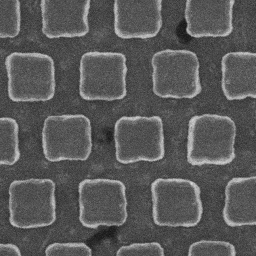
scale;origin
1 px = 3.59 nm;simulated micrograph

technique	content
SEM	a regular array of raised bodies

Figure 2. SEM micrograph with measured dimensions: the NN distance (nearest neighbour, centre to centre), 255 nm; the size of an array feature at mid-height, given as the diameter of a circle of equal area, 180 nanometres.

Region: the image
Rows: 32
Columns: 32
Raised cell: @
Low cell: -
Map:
@@---@@@@@@---@@@@@@---@@@@@@---
@@---@@@@@@---@@@@@@---@@@@@@---
@@---@@@@@@---@@@@@@---@@@@@@---
@@---@@@@@@---@@@@@@---@@@@@@---
@@----@@-------@@@--------------
--------------------------------
--------------------@@@---------
-@@@@@----@@@@@@---@@@@@@---@@@@
-@@@@@@---@@@@@@---@@@@@@---@@@@
-@@@@@@---@@@@@@---@@@@@@---@@@@
-@@@@@@---@@@@@@---@@@@@@---@@@@
-@@@@@@---@@@@@@---@@@@@@---@@@@
-----@--------------------------
--------------------------------
-------------------------@@@----
@@----@@@@@----@@@@@----@@@@@---
@@---@@@@@@---@@@@@@----@@@@@---
@@---@@@@@@---@@@@@@----@@@@@---
@@----@@@@@----@@@@@----@@@@@---
@@----@@@@@----@@@@@----@@@@@---
--------------------------------
--------------------------------
---@@@-----@@@------@---------@@
-@@@@@@---@@@@@----@@@@@----@@@@
-@@@@@@---@@@@@@---@@@@@@---@@@@
-@@@@@@---@@@@@@---@@@@@@---@@@@
-@@@@@@---@@@@@@---@@@@@@---@@@@
-@@@@@@---@@@@@@----@@@@@---@@@@
--------------------------------
--------------------------------
-----------------@@-----@@@@@---
@@----@@@@@----@@@@@----@@@@@---